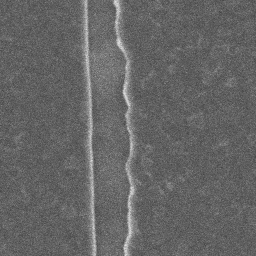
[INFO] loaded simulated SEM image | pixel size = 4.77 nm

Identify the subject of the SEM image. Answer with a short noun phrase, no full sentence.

one or a few lines or trenches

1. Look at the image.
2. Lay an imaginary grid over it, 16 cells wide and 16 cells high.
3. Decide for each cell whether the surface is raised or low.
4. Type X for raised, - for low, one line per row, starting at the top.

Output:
XXXXX--XXXXXXXXX
XXXXX--XXXXXXXXX
XXXXX--XXXXXXXXX
XXXXX---XXXXXXXX
XXXXXX--XXXXXXXX
XXXXXX--XXXXXXXX
XXXXXX--XXXXXXXX
XXXXXX--XXXXXXXX
XXXXXX--XXXXXXXX
XXXXXX--XXXXXXXX
XXXXXX--XXXXXXXX
XXXXXX--XXXXXXXX
XXXXXX--XXXXXXXX
XXXXXX--XXXXXXXX
XXXXXX--XXXXXXXX
XXXXXX--XXXXXXXX